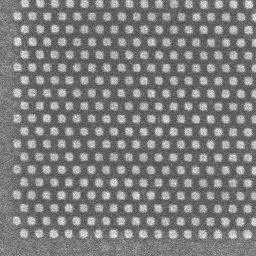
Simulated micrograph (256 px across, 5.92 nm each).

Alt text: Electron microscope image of a regular array of raised bodies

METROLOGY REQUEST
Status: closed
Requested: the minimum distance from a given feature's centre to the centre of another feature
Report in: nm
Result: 85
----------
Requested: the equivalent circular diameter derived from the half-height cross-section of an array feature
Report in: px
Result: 7.65